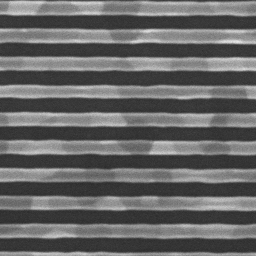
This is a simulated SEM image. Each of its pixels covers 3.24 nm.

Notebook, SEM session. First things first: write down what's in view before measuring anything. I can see wiring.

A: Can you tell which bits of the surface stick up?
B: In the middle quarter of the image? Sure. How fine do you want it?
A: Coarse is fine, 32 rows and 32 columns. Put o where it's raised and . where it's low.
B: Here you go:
oooooooooooooooooooooooooooooooo
oooooooooooo.ooooooooooooooooooo
................................
................................
................................
.........oo............ooo......
oooooooooooooooooooooooooooooooo
oooooooooooooooooooooooooooooooo
............................oooo
................................
................................
................................
o...oooooooooooooooooooooo......
oooooooooooooooooooooooooooooooo
oooooooooooooooooooooooooooooooo
........................oo..oooo
................................
................................
................................
oooooooooooooooooooooooooooooooo
oooooooooooooooooooooooooooooooo
oooooooooooooooooooooooooooooooo
o........ooooooooo.ooooooooooooo
................................
................................
................................
oooooooooooooooooooooooooooooooo
oooooooooooooooooooooooooooooooo
oooooooooooooooooooooooooooooooo
................oooooo..........
................................
................................